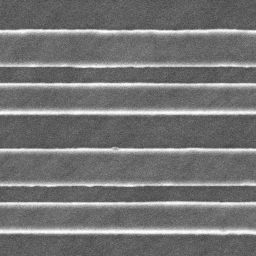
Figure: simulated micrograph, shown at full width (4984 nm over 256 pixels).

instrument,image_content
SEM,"lines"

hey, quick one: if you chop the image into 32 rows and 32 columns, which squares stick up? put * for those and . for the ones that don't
................................
................................
................................
................................
********************************
********************************
********************************
********************************
................................
................................
................................
********************************
********************************
********************************
................................
................................
................................
................................
..............*.................
********************************
********************************
********************************
********************************
................................
................................
********************************
********************************
********************************
********************************
................................
................................
................................